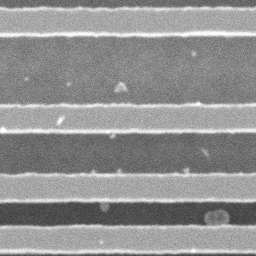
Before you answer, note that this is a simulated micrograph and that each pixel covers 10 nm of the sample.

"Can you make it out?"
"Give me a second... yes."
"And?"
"lines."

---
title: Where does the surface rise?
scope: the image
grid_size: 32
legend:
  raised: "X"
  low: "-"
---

--------------------------------
XXXXXXXXXXXXXXXXXXXXXXXXXXXXXXXX
XXXXXXXXXXXXXXXXXXXXXXXXXXXXXXXX
XXXXXXXXXXXXXXXXXXXXXXXXXXXXXXXX
--------------------------------
--------------------------------
--------------------------------
--------------------------------
--------------------------------
--------------------------------
--------------------------------
--------------------------------
--------------------------------
XXXXXXXXXXXXXXXXXXXXXXXXXXXXXXXX
XXXXXXXXXXXXXXXXXXXXXXXXXXXXXXXX
XXXXXXXXXXXXXXXXXXXXXXXXXXXXXXXX
XX---X-XX-XXXXX----X------------
--------------------------------
--------------------------------
--------------------------------
--------------------------------
--------------------------------
XXXXXXXXXXXXXXXXXXXXXXXXXXXXXXXX
XXXXXXXXXXXXXXXXXXXXXXXXXXXXXXXX
XXXXXXXXXXXXXXXXXXXXXXXXXXXXXXXX
--------------------------------
--------------------------------
--------------------------------
XXXXXXXXXXXXXXXXXXXXXXXXXXXXXXXX
XXXXXXXXXXXXXXXXXXXXXXXXXXXXXXXX
XXXXXXXXXXXXXXXXXXXXXXXXXXXXXXXX
XXXXXXXXXXXXXXXXXXXXXXXXXXXXXXXX